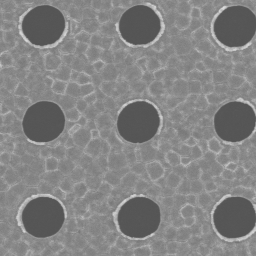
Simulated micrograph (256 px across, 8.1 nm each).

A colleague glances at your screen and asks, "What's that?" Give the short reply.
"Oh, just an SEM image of holes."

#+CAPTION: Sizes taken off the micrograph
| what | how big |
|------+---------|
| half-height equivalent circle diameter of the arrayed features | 339 nm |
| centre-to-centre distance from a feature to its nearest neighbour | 773 nm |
